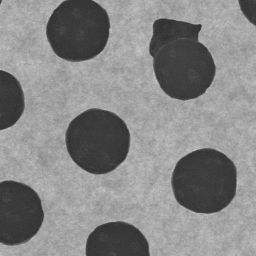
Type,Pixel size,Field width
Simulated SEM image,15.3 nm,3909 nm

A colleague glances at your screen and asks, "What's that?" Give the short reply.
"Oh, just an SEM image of holes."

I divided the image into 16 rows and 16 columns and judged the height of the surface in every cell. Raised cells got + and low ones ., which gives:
++++..+++++++++.
+++....+++..++++
+++....++....+++
++++..+++....+++
++++++++++...+++
.+++++++++...+++
..++++++++++++++
.++++...++++++++
++++....++++++++
++++....++++..++
+++++..++++....+
.++++++++++....+
..+++++++++...++
...+++++++++++++
..++++...+++++++
+++++....+++++++